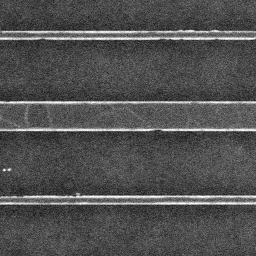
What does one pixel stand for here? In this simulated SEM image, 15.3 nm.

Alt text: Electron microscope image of lines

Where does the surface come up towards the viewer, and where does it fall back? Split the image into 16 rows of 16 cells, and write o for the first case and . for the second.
................
................
................
................
................
................
oooooooooooooooo
oooooooooooooooo
................
................
................
................
................
................
................
................